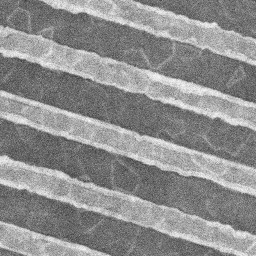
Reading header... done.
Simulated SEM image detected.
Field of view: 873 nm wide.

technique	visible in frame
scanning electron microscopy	one or a few lines or trenches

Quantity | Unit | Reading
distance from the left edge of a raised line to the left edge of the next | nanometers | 212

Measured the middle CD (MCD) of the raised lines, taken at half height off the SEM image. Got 82.3 nm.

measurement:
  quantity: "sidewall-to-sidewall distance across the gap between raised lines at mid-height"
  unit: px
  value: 38.2